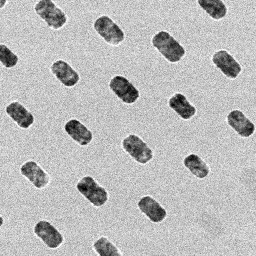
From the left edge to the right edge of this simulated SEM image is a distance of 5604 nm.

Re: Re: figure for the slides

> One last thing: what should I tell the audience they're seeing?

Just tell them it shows a regular array of holes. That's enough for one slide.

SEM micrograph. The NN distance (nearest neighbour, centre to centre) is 1340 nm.